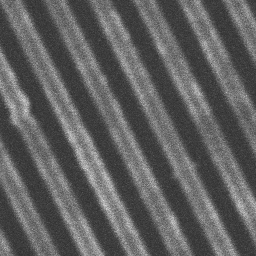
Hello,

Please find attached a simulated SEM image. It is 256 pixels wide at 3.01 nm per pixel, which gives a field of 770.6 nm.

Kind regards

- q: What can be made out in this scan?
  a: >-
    parallel lines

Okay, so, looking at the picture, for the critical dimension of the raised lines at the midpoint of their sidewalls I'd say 59.6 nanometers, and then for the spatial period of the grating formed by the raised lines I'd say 121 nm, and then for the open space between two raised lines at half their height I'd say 60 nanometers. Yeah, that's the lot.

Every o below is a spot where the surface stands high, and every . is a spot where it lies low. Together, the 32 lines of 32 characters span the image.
ooo...oo...ooo...ooo..ooo...ooo.
.oo...ooo...ooo..ooo...ooo...oo.
.ooo...oo...ooo...ooo..ooo...ooo
..oo...ooo...ooo..ooo...ooo...oo
..ooo...oo...ooo...ooo..ooo...oo
...oo...ooo...ooo..ooo...ooo...o
...ooo...oo...ooo...ooo...oo...o
o...oo...ooo...ooo..ooo...ooo...
o...ooo...oo...ooo...ooo...oo...
oo...oo...ooo...ooo..ooo...ooo..
oo...ooo...oo...ooo...ooo..ooo..
ooo...oo...ooo...ooo..ooo...ooo.
ooo...ooo...oo...ooo...ooo..ooo.
.ooo...oo...ooo...ooo..ooo...ooo
.ooo...ooo...oo...ooo...ooo..ooo
..ooo...oo...ooo...ooo..ooo...oo
..ooo...ooo...oo...ooo...ooo...o
...ooo...oo...ooo...ooo..ooo...o
o..ooo...ooo...oo...ooo...ooo...
o...ooo...oo...ooo...ooo..ooo...
oo..ooo...ooo...oo...ooo...ooo..
oo...ooo...oo...ooo...ooo..ooo..
ooo..ooo...ooo...oo...ooo...ooo.
ooo...ooo...oo...ooo...ooo..ooo.
.ooo..ooo...ooo...oo...ooo...ooo
.ooo...ooo...oo...ooo...ooo..ooo
..ooo..ooo...ooo...oo...ooo...oo
..ooo...ooo...oo...ooo...ooo..oo
...ooo..ooo...ooo...oo...ooo...o
o..ooo...ooo...oo...ooo...ooo..o
o...ooo..ooo...ooo...oo...ooo...
oo..ooo...ooo...oo...ooo...ooo..